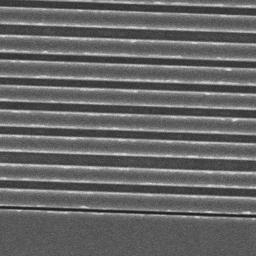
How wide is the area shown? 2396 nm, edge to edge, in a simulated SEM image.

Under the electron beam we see parallel lines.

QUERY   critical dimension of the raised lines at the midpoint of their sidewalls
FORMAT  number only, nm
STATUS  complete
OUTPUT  157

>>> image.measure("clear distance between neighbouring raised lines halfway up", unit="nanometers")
74.8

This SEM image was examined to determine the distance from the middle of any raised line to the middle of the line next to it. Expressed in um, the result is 0.243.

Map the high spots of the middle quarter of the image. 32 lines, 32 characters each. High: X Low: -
XXXXXXXXXXXXXXXXXXXXXXXX--------
XXXXXXXXXXXXXXXXXXXXXXXXXXXXXXXX
XXXXXXXXXXXXXXXXXXXXXXXXXXXXXXXX
XXXXXXXXXXXXXXXXXXXXXXXXXXXXXXXX
-------------------------XXXXXXX
--------------------------------
XXXXXXXXXXXXXXXXXXX-------------
XXXXXXXXXXXXXXXXXXXXXXXXXXXXXXXX
XXXXXXXXXXXXXXXXXXXXXXXXXXXXXXXX
XXXXXXXXXXXXXXXXXXXXXXXXXXXXXXXX
--------------------------XXXXXX
--------------------------------
XXXXXXXXXXXXXX------------------
XXXXXXXXXXXXXXXXXXXXXXXXXXXXXXXX
XXXXXXXXXXXXXXXXXXXXXXXXXXXXXXXX
XXXXXXXXXXXXXXXXXXXXXXXXXXXXXXXX
---------------XXXXXXXXXXXXXXXXX
--------------------------------
XXXXXXXXX-----------------------
XXXXXXXXXXXXXXXXXXXXXXXXXXXXXXXX
XXXXXXXXXXXXXXXXXXXXXXXXXXXXXXXX
XXXXXXXXXXXXXXXXXXXXXXXXXXXXXXXX
---------XXXXXXXXXXXXXXXXXXXXXXX
--------------------------------
--------------------------------
X-------------------------------
XXXXXXXXXXXXXXXXXXXXXXXXXXXXX---
XXXXXXXXXXXXXXXXXXXXXXXXXXXXXXXX
XXXXXXXXXXXXXXXXXXXXXXXXXXXXXXXX
-XXXXXXXXXXXXXXXXXXXXXXXXXXXXXXX
------------------------------XX
--------------------------------